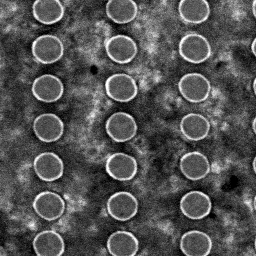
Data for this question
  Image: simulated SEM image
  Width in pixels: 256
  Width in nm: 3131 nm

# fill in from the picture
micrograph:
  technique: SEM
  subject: a regular array of raised bodies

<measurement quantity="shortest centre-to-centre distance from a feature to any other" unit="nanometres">479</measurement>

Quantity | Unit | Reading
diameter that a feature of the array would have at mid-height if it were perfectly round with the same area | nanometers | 348